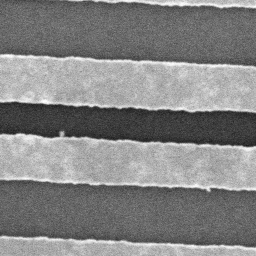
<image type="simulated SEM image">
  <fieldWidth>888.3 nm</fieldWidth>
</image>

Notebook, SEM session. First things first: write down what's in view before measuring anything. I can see lines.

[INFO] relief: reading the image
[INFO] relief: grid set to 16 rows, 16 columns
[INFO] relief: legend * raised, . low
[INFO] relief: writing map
................
................
................
*...............
****************
****************
....************
................
**..............
****************
****************
......**********
................
................
................
****************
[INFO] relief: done